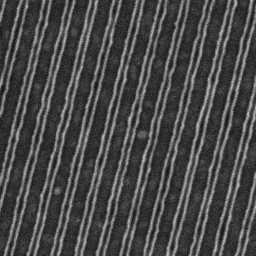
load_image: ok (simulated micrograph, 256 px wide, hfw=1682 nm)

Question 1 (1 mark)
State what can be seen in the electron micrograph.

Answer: parallel lines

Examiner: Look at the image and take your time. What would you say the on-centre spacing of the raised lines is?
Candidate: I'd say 0.148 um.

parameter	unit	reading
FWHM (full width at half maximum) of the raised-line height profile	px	7.29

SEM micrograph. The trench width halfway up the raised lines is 100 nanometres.